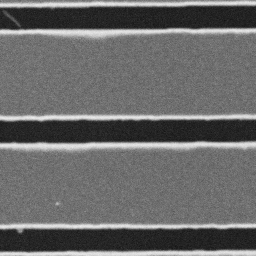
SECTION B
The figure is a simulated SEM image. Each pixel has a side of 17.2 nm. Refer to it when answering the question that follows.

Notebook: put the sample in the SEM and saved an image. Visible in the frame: lines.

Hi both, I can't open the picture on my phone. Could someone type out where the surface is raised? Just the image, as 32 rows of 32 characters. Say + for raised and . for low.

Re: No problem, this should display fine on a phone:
++++++++++++++++++++++++++++++++
................................
................................
................................
++++++++++++++++++++++++++++++++
++++++++++++++++++++++++++++++++
++++++++++++++++++++++++++++++++
++++++++++++++++++++++++++++++++
++++++++++++++++++++++++++++++++
++++++++++++++++++++++++++++++++
++++++++++++++++++++++++++++++++
++++++++++++++++++++++++++++++++
++++++++++++++++++++++++++++++++
++++++++++++++++++++++++++++++++
++++++++++++++++++++++++++++++++
................................
................................
................................
++++++++++++++++++++++++++++++++
++++++++++++++++++++++++++++++++
++++++++++++++++++++++++++++++++
++++++++++++++++++++++++++++++++
++++++++++++++++++++++++++++++++
++++++++++++++++++++++++++++++++
++++++++++++++++++++++++++++++++
++++++++++++++++++++++++++++++++
++++++++++++++++++++++++++++++++
++++++++++++++++++++++++++++++++
................................
................................
................................
..................++++++++++++++